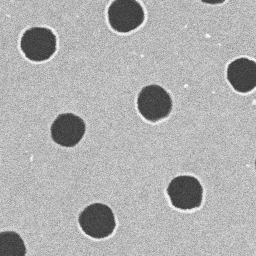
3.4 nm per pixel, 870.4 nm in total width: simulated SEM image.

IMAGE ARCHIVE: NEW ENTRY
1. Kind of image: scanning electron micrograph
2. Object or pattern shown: holes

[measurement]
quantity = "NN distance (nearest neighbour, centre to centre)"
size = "0.309 micrometres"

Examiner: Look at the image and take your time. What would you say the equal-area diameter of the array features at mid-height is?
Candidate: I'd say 118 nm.